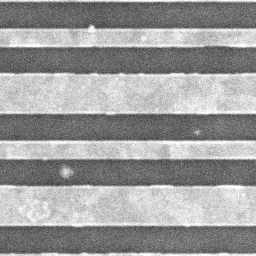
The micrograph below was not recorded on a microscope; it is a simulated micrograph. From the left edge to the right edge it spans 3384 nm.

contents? lines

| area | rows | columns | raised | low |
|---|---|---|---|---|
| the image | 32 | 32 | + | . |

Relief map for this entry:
................................
................................
................................
...........+....................
++++++++++++++++++++++++++++++++
++++++++++++++++++++++++++++++++
................................
................................
................................
++++++++++++++++++++++++++++++++
++++++++++++++++++++++++++++++++
++++++++++++++++++++++++++++++++
++++++++++++++++++++++++++++++++
++++++++++++++++++++++++++++++++
................................
................................
................................
................................
++++++++++++++++++++++++++++++++
++++++++++++++++++++++++++++++++
................................
................................
................................
++++++++++++++++++++++++++++++++
++++++++++++++++++++++++++++++++
++++++++++++++++++++++++++++++++
++++++++++++++++++++++++++++++++
++++++++++++++++++++++++++++++++
................................
................................
................................
................................